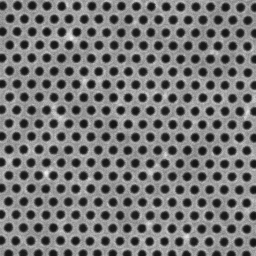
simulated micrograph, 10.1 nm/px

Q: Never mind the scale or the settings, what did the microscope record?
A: a regular array of holes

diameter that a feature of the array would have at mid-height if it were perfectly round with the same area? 0.0982 µm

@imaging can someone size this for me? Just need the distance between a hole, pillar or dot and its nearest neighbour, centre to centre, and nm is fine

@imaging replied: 146